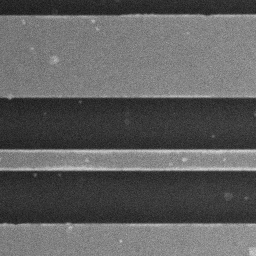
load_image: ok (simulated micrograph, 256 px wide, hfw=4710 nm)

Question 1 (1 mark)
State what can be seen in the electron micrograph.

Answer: lines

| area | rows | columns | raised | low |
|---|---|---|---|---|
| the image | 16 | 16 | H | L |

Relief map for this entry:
LLLLLLLLLLLLLLLL
HHHHHHHHHHHHHHHH
HHHHHHHHHHHHHHHH
HHHHHHHHHHHHHHHH
HHHHHHHHHHHHHHHH
HHHHHHHHHHHHHHHH
LLLLLLLLLLLLLLLL
LLLLLLLLLLLLLLLL
LLLLLLLLLLLLLLLL
HHHHHHHHHHHHHHHH
HHHHHHHHHHHHHHHH
LLLLLLLLLLLLLLLL
LLLLLLLLLLLLLLLL
LLLLLLLLLLLLLLLL
HHHHHHHHHHHHHHHH
HHHHHHHHHHHHHHHH